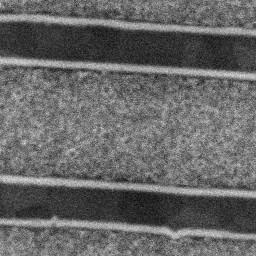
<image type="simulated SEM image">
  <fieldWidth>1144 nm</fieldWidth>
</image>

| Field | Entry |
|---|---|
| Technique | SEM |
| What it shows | one or a few lines or trenches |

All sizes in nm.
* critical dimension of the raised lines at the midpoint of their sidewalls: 194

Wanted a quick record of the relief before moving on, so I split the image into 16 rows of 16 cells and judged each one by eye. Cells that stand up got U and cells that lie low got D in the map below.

DDDDDDDDDDDDDDDD
UUUUUUUDDDDDDDDD
UUUUUUUUUUUUUUUU
UUUUUUUUUUUUUUUU
DDDDDDDDDDDUUUUU
DDDDDDDDDDDDDDDD
DDDDDDDDDDDDDDDD
DDDDDDDDDDDDDDDD
DDDDDDDDDDDDDDDD
DDDDDDDDDDDDDDDD
DDDDDDDDDDDDDDDD
UUUUUUDDDDDDDDDD
UUUUUUUUUUUUUUUU
UUUUUUUUUUUUUUUU
DDDDDDDDDDUUUUUU
DDDDDDDDDDDDDDDD